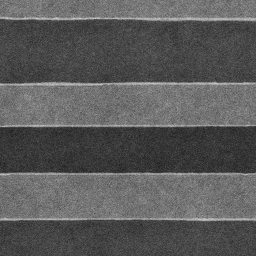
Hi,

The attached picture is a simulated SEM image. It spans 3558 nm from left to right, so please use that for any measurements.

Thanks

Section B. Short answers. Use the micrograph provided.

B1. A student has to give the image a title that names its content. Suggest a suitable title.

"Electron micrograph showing lines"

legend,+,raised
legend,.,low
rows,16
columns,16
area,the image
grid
++++++++++++++++
................
................
................
................
++++++++++++++++
++++++++++++++++
++++++++++++++++
................
................
................
++++++++++++++++
++++++++++++++++
++++++++++++++++
................
................